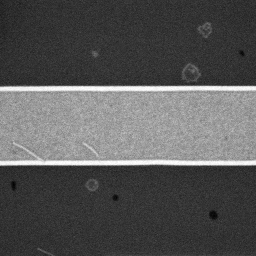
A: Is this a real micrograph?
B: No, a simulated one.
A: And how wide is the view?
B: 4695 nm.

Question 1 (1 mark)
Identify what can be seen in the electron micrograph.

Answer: wiring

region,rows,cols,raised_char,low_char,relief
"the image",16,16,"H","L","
LLLLLLLLLLLLLLLL
LLLLLLLLLLLLLLLL
LLLLLLLLLLLLLLLL
LLLLLLLLLLLLLLLL
LLLLLLLLLLLLLLLL
LLLLLLLLLLLLLLLL
HHHHHHHHHHHHHHHH
HHHHHHHHHHHHHHHH
HHHHHHHHHHHHHHHH
HHHHHHHHHHHHHHHH
LLLLLLLLLLLLLLLL
LLLLLLLLLLLLLLLL
LLLLLLLLLLLLLLLL
LLLLLLLLLLLLLLLL
LLLLLLLLLLLLLLLL
LLLLLLLLLLLLLLLL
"